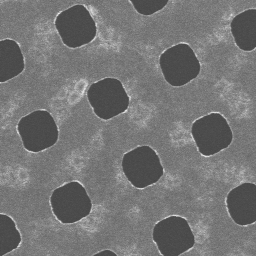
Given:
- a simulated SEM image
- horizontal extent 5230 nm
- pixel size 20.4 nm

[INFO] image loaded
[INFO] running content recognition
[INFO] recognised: holes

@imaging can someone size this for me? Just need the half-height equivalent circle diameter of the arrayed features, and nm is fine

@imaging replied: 829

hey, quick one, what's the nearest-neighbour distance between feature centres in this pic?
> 1570 nm